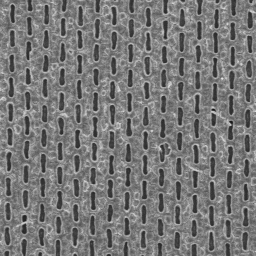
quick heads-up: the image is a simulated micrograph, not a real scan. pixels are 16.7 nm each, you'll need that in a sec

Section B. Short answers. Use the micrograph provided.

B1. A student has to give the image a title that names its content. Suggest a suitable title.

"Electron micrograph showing a regular array of holes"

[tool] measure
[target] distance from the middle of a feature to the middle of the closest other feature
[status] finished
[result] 340 nm